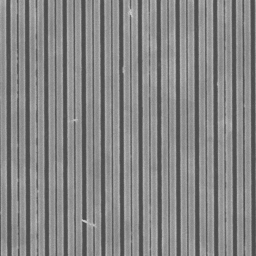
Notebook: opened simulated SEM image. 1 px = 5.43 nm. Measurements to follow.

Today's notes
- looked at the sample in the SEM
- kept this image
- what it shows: parallel lines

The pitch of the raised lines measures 50.8 nm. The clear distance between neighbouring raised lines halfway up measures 23.8 nm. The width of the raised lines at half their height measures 33.9 nm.